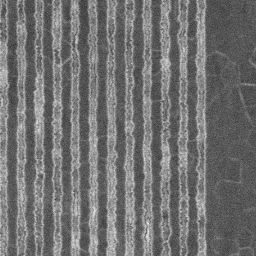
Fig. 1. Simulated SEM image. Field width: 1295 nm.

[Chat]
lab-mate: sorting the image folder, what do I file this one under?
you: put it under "parallel lines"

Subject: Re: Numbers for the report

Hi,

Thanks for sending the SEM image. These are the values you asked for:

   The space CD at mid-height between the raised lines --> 0.0266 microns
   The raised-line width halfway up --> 64.5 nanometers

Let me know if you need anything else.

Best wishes